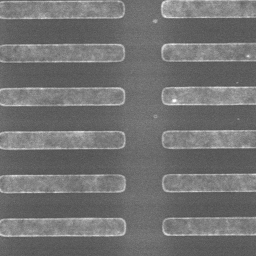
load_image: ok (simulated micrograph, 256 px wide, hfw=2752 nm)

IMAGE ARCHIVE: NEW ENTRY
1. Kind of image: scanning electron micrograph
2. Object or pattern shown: groups of lines, slits or small figures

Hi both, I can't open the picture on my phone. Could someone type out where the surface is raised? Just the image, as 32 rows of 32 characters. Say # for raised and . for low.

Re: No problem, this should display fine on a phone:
###############.....############
################....############
................................
................................
................................
............................####
################....############
###############......###########
................................
................................
................................
################....############
################....############
................................
................................
................................
###############......###########
################....############
###############......###........
................................
................................
................................
################....############
################....############
................................
................................
................................
###############......###########
################....############
##############..................
................................
................................